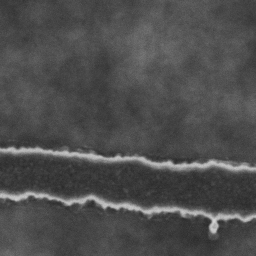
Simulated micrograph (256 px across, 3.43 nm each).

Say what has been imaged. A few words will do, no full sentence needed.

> one or a few lines or trenches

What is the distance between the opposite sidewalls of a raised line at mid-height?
0.166 um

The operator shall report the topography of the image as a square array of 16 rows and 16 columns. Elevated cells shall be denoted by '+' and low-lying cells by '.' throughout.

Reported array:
................
................
................
................
................
................
................
................
................
+++.............
++++++++++++++++
++++++++++++++++
....+.++++++++++
.............+++
................
................